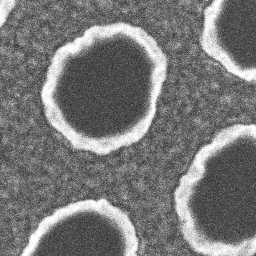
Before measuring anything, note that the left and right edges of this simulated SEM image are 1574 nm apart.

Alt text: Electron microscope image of raised bodies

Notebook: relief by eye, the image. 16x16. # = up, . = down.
.............###
.............###
.....####....###
....######....##
...#######.....#
...#######......
...#######......
...######.......
....####......##
.............###
............####
............####
...........#####
...####.....####
..######....####
..######.....###